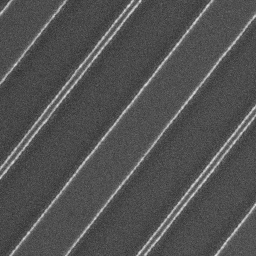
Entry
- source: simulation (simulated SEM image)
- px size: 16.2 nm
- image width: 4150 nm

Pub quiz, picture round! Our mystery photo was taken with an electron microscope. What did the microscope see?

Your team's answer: lines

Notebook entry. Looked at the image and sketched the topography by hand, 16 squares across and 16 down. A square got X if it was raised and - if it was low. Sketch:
XXXX---------XXX
XXX---------XXXX
XX---------XXXX-
X---------XXXX--
X---------XXX---
---------XXX----
--------XXXX----
-------XXXX-----
-------XXX------
------XXX-------
-----XXX--------
----XXXX--------
---XXXX---------
---XXX---------X
--XXX----------X
-XXXX---------XX